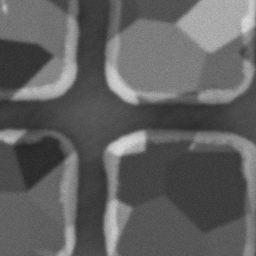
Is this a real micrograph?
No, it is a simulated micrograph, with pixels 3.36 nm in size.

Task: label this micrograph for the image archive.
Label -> raised bodies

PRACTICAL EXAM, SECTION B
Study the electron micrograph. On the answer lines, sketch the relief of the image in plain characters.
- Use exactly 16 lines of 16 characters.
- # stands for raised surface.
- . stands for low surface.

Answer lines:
#####..#########
#####..#########
#####..#########
#####..#########
####...#########
####...########.
................
................
####.....#####..
#####..#########
#####..#########
#####..#########
####...#########
####...#########
####...#########
####...#########